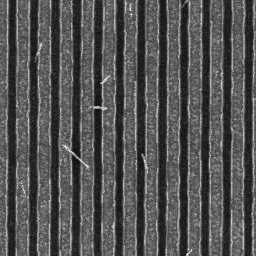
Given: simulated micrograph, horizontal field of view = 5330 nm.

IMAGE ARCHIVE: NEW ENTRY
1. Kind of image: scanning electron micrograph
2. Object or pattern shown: parallel lines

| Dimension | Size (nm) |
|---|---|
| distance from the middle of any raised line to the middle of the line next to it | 448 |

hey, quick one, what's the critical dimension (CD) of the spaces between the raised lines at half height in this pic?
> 8.75 pixels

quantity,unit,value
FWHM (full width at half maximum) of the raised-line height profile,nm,266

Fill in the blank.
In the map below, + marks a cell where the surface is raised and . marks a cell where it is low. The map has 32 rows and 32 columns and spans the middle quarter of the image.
++..+++...+++..+++..++++..+++..+
++..+++..++++..+++..++++..+++..+
++..+++...+++..+++..++++..+++..+
++..+++...+++..+++..++++..+++..+
++..+++..++++..+++...+++..+++..+
++..+++...+++..+++...+++..+++..+
++..+++...+++..+++..++++..+++..+
++..+++...+++..+++..++++..+++..+
++..+++...+++..+++..++++..+++..+
++..+++...+++..+++..++++..+++..+
++..++++.++++..+++...+++..+++..+
++..+++..++++..+++...+++..+++..+
++..+++...+++..+++...+++..+++..+
++..+++...+++..+++..++++..+++..+
++..+++...+++..+++..++++..+++..+
++..+++...+++..+++...++...+++..+
++..+++...+++..+++...++...+++..+
++..+++...+++..+++..+++...+++..+
++..+++...+++..+++...++...+++..+
++..+++..++++..+++...++...+++..+
++..+++..++++..+++...++...+++..+
++..+++..++++..+++...++...+++..+
+++.+++...+++..+++...++...+++..+
++.++++...+++..+++..+++...+++..+
++..+++...+++..+++..+++...+++..+
++..+++...+++..+++..+++...+++..+
++..+++...+++..+++..+++...+++..+
++..+++...+++..+++...++...+++..+
++..+++...+++..+++..+++...+++..+
++..+++...+++..+++..+++...+++..+
++..+++...+++..+++..+++...+++..+
++..+++...+++..+++..+++...+++..+